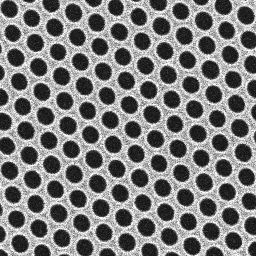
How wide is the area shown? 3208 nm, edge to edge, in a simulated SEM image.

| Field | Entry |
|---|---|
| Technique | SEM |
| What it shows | a regular array of holes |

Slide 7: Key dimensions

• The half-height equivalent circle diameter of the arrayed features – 213 nm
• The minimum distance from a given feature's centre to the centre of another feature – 0.304 microns